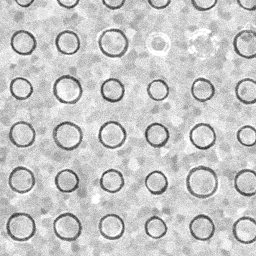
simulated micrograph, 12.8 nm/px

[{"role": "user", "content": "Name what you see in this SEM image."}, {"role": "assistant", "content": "a regular array of ring-shaped grooves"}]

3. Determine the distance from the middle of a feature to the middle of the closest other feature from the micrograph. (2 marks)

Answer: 582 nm